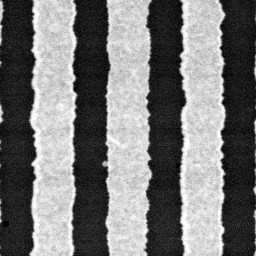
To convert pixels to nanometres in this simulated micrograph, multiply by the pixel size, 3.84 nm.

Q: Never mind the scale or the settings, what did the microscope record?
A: lines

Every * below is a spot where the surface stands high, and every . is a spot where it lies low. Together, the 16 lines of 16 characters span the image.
..***..**..***..
..***..**..***..
..***..**..***..
..***..**..***..
..***..**..***..
..***..**..***..
..***..**...**..
..***..**..***..
..***..**..***..
..***..**..***..
..***..**..***..
..***..**..***..
..***..**..***..
..**...**..***..
..**...**..***..
..***..**..***..